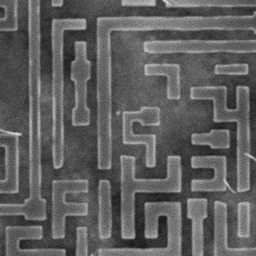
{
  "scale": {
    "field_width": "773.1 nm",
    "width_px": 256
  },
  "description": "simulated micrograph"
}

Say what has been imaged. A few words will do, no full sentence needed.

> wiring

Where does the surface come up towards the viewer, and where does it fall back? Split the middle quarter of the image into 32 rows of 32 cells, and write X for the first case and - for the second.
--XXXX--XXXX--------XXXXXXXXX---
--XXXX--XXXX--------XXXXXXXXX---
--XXXX--XXXX---------XXXXXXXX---
--XXXX--XXXX--------------XXX---
---XXX--XXXX--------------XXX---
---XXX--XXXX--------------XXX---
---XXX--XXXX--------------XXX---
---XXX--XXXX--------------XXX---
---XXX--XXXX--------------XXX---
---XXX--XXXX--------------------
---XXX--XXXX--------------------
--XXXX--XXXX-------XXXXX--------
--XXXX--XXXX-X-XXXXXXXXX--------
--XXXX--XXXX---XXXXXXXXX--------
--XXXX--XXXX---XX--XXXXX--------
--------XXXX---XX---------------
--------XXXX---XX---------------
--------XXXX---XX---------------
--------XXXX---XXXXXXXX---------
---------XXX---XXXXXXXX---------
---------XXX---------XX---------
---------XXX---------XX---------
---------XXX---------XX---------
---------XXX--XXX----XX---XXX---
---------XXX--XXXX---XX---XXX---
---------XXX--XXXX---X----XXX---
---------------XX---------XXX---
---------------XX---------XXX---
---------------XXX--------XXX---
XXXXXX---XX---XXXXXXXXXXXXXXX---
XXXXXX---XX---XXXXXXXXXXXXXXX---
XXXXXX---XXX--XXXXXXXXXXXXXXX---